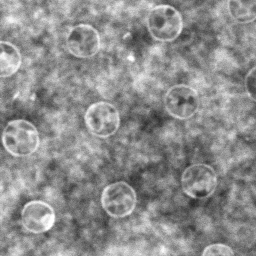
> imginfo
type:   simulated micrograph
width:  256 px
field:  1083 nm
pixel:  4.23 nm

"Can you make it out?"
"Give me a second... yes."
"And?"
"a regular array of raised bodies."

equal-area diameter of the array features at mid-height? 143 nm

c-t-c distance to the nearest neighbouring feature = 341 nanometers